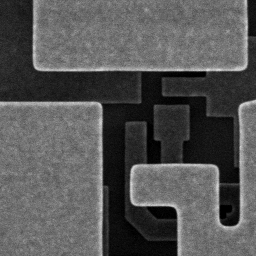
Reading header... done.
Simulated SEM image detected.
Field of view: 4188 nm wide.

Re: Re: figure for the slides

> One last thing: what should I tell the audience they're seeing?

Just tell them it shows wiring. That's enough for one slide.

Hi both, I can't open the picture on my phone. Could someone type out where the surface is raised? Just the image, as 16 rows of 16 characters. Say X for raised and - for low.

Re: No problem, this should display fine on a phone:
--XXXXXXXXXXXXX-
--XXXXXXXXXXXXX-
--XXXXXXXXXXXXX-
--XXXXXXXXXXXXX-
----------------
----------------
XXXXXX---------X
XXXXXX---------X
XXXXXX---------X
XXXXXX---------X
XXXXXX--XXXXX--X
XXXXXX--XXXXXX-X
XXXXXX--XXXXXX-X
XXXXXX-----XXX-X
XXXXXX-----XXXXX
XXXXXX-----XXXXX